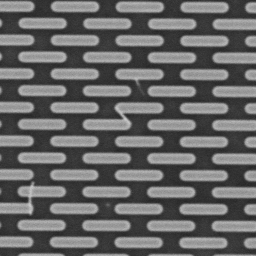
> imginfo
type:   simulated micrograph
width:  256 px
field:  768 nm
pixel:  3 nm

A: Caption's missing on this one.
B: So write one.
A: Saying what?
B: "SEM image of groups of lines, slits or small figures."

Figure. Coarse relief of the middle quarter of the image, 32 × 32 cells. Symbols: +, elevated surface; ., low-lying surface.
................................
++++++++......+++++++...........
++++++++.....++++++++++++....+++
++++++++.....++++++++++++....+++
................................
.....+++++++++++................
.....++++++++++++....+++++++++++
.....+++++++++++.....+++++++++++
................................
................................
++++++++.....++++++++++++....+++
++++++++.....++++++++++++....+++
..............+.................
...............+................
.....++++++++++++....+++++++++++
.....++++++++++++....+++++++++++
................................
................................
++++++++.....+++++++++++......++
++++++++.....++++++++++++....+++
++++++++......++++++++++......++
................................
.....+++++++++++......+++++++++.
.....++++++++++++....+++++++++++
.....+++++++++++.....+++++++++++
................................
................................
++++++++.....++++++++++++....+++
++++++++.....++++++++++++....+++
................................
................................
.....+++++++++++.....+++++++++++